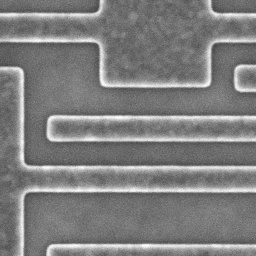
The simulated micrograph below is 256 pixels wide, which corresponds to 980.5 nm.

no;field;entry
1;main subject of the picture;wiring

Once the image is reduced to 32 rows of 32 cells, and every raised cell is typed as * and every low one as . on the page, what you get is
.............*************......
............***************.....
********************************
********************************
********************************
............***************.....
.............*************......
.............*************......
**...........*************....**
***..........*************...***
***..........*************...***
***.............................
***.............................
***.............................
***.............................
***...**************************
***...**************************
***...**************************
***.............................
***.............................
***.............................
********************************
********************************
********************************
***.............................
***.............................
***.............................
***.............................
***.............................
***.............................
***.............................
***...**************************